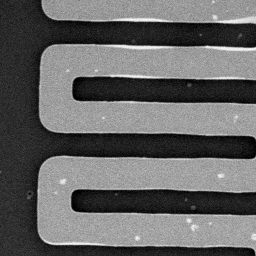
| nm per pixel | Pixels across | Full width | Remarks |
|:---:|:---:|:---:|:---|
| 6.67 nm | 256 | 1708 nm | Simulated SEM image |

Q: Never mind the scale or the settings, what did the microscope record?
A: groups of lines, slits or small figures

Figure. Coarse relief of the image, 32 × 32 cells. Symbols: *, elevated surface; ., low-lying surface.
.....***************************
......**************************
..........*****....************.
................................
................................
................................
......**************************
.....***************************
.....***************************
.....***************************
.....****.......................
.....****.......................
.....****.......................
.....***************************
.....***************************
.....***************************
.......*************************
................................
................................
................................
.....***************************
.....***************************
.....***************************
.....***************************
.....****.......................
.....****.......................
.....*****......................
.....***************************
.....***************************
.....***************************
............********************
................................